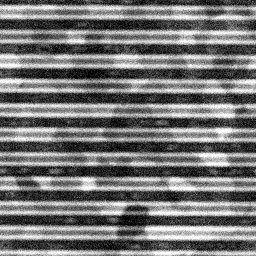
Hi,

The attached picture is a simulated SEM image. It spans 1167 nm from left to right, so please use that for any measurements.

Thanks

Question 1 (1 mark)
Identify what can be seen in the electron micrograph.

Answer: parallel lines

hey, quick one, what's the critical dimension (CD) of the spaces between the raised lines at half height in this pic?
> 61.6 nm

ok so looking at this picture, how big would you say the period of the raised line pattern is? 112 nanometres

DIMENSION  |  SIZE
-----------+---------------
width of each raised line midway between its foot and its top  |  48.5 nm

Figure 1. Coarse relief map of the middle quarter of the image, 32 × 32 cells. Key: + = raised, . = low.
++++++++++++++++++++++++++++++++
................................
................................
................................
++++++++++++++++++++++++++++++++
++++++++++++++++++++++++++++++++
++++++++++++++++++++++++++++++++
................................
................................
................................
+++++++++++++++++++++++++.......
++++++++++++++++++++++++++++++++
++++++++++++++++++++++++++++++++
................................
................................
................................
++++++++++++++++++++++++++++....
++++++++++++++++++++++++++++++++
++++++++++++++++++++++++++++++++
................................
................................
................................
................................
++++++++++++++++++++++++++++++++
++++++++++++++++++++++++++++++++
................................
................................
................................
................................
++++++++++++++++++++++++++++++++
++++++++++++++++++++++++++++++++
................................